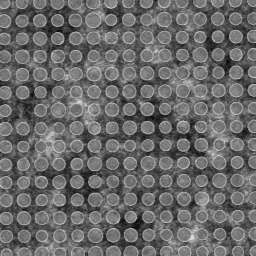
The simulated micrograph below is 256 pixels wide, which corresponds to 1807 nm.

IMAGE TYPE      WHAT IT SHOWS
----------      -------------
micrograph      a regular array of raised bodies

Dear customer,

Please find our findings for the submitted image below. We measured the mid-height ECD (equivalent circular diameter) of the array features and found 0.0909 micrometres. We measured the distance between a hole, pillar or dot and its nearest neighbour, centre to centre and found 17.5 px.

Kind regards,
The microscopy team